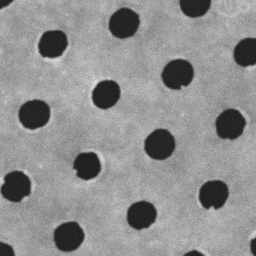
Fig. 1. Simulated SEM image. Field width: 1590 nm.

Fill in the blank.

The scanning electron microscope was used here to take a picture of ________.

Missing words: a regular array of holes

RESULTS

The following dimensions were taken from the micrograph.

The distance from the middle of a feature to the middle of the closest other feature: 452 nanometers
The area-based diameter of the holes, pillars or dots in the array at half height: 188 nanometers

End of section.